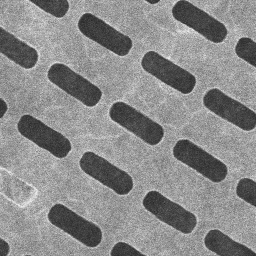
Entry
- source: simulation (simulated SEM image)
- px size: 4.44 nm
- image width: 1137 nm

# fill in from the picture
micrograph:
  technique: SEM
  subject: a regular array of holes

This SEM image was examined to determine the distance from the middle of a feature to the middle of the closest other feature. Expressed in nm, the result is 265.